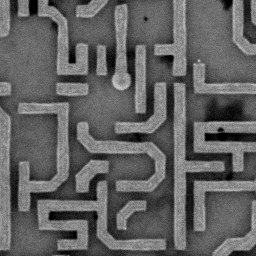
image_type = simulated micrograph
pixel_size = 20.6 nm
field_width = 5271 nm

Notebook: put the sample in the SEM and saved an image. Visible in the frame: wiring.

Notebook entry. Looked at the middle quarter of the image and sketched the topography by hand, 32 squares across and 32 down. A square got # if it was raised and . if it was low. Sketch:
######..##...###..##........##..
######..###..###..##.......###..
.............###..##........##..
............#####.##............
............#####.##............
######.......###..##...##...##..
######............##...##...##..
#####.............##...##...##..
..................##...##...##..
..................##...##...##..
#.................##...##...##..
#.................##...##...##..
#.....................###...##..
#.....................###...##..
#...................#####...##..
#...##.......###########....##..
#...##.......##########.....##..
#...##......................##..
#...###.....................##..
#...##########..............##..
#....##################.....##..
#.....##################....##..
#....................####...##..
#.....................###...##..
#.....#####............##...####
#....######............##...####
#...#######............##...####
#..#####...............##...##..
#..####...............###...##..
...###...#...###########....##..
...###...##..##########.....##..
...###..###..#########......##..